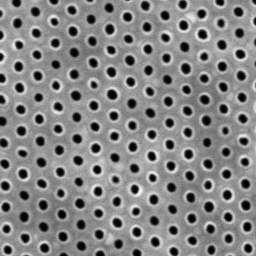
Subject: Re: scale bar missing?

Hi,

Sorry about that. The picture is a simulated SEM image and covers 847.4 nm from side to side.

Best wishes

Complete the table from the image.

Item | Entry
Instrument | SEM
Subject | a regular array of holes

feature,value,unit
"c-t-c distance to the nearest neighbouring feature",69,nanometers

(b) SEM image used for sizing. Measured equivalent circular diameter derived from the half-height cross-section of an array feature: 0.0279 microns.